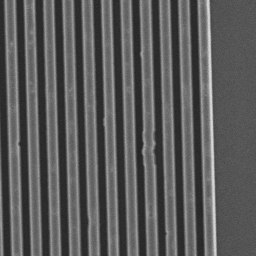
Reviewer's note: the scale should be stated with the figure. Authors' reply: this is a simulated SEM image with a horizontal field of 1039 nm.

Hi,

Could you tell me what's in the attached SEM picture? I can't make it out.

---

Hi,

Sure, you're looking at parallel lines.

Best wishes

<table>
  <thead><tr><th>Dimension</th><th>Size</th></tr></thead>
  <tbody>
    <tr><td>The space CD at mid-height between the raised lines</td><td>36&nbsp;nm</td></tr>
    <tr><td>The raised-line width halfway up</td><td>44.2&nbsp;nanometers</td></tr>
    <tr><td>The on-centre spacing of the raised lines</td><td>0.0785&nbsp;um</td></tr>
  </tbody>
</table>